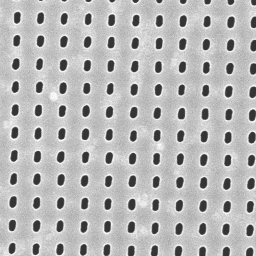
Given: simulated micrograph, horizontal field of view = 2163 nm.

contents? a regular array of holes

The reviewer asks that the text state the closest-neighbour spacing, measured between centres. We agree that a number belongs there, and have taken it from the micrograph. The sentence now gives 193 nm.